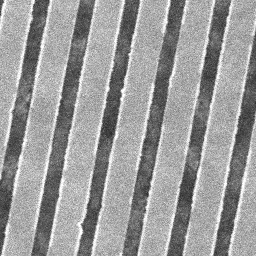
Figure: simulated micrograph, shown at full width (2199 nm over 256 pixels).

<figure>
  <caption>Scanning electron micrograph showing parallel lines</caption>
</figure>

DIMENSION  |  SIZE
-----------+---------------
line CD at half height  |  248 nanometers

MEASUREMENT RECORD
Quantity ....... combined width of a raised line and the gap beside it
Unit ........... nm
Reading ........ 383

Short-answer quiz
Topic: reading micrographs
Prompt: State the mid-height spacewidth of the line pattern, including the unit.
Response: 135 nanometers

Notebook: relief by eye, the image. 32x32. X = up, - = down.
XXXX--XXXX--XXX--XXXX--XXXX--XXX
XXXX--XXXX--XXX--XXXX--XXXX--XXX
XXXX--XXX--XXXX--XXXX--XXX--XXXX
XXXX--XXX--XXXX--XXXX--XXX--XXXX
XXX--XXXX--XXXX--XXX--XXXX--XXXX
XXX--XXXX--XXXX-XXXX--XXXX--XXX-
XXX--XXXX--XXX--XXXX--XXXX--XXX-
XXX--XXX--XXXX--XXXX--XXX--XXXX-
XXX--XXX--XXXX--XXXX--XXX--XXXX-
XXX--XXX--XXXX--XXX--XXXX--XXXX-
XX--XXXX--XXXX--XXX--XXXX--XXXX-
XX--XXXX--XXX--XXXX--XXXX--XXX--
XX--XXXX--XXX--XXXX--XXXX--XXX--
XX--XXX--XXXX--XXXX--XXX--XXXX--
X---XXX--XXXX--XXXX--XXX--XXXX--
X--XXXX--XXXX--XXX--XXXX--XXXX--
X--XXXX--XXX--XXXX--XXXX--XXXX--
X--XXXX--XXX--XXXX--XXXX--XXX--X
X--XXX--XXXX--XXXX--XXX--XXXX--X
X--XXX--XXXX--XXXX--XXX--XXXX--X
--XXXX--XXXX--XXX--XXXX-XXXXX--X
--XXXX--XXXX-XXXX--XXXX--XXXX--X
--XXXX--XXX--XXXX--XXXX--XXX--XX
--XXX---XXX--XXXX--XXX--XXXX--XX
--XXX--XXXX--XXXX--XXX--XXXX--XX
-XXXX--XXXX--XXX--XXXX--XXXX--XX
-XXXX--XXXX--XXX--XXXX--XXXX--XX
-XXXX--XXX--XXXX--XXXX--XXX--XXX
-XXX---XXX--XXXX--XXX--XXXX--XXX
-XXX--XXXX--XXXX--XXX--XXXX--XXX
XXXX--XXXX--XXX--XXXX--XXXX--XXX
XXXX--XXXX--XXX--XXXX--XXXX--XXX